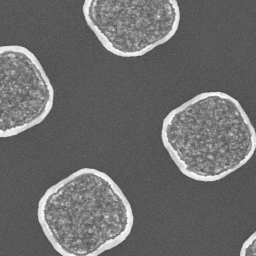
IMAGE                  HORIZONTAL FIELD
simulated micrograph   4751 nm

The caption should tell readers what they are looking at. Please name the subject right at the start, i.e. raised bodies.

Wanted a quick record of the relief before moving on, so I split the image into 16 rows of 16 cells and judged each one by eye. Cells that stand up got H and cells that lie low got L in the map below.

LLLLLHHHHHHLLLLL
LLLLLLHHHHHLLLLL
LLLLLLHHHHLLLLLL
HHLLLLLLLLLLLLLL
HHHLLLLLLLLLLLLL
HHHLLLLLLLLLLLLL
HHHLLLLLLLLLHHHL
HHLLLLLLLLHHHHHL
LLLLLLLLLLHHHHHH
LLLLLLLLLLLHHHHH
LLLLLLLLLLLHHHHL
LLLLHHHLLLLLLLLL
LLLHHHHHLLLLLLLL
LLLHHHHHLLLLLLLL
LLLHHHHHLLLLLLLL
LLLLHHHLLLLLLLLH